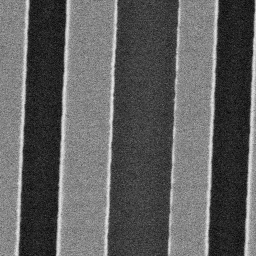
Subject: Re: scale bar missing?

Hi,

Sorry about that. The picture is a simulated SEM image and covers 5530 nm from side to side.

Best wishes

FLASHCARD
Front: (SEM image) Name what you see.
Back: lines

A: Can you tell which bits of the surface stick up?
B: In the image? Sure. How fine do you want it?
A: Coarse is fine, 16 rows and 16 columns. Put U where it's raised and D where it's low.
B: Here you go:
UUDDUUUDDDDUUUDD
UUDDUUUDDDDUUUDD
UUDDUUUDDDDUUUDD
UUDDUUUDDDDUUDDD
UUDDUUUDDDDUUDDD
UUDDUUUDDDDUUDDD
UUDDUUUDDDDUUDDD
UDDDUUUDDDDUUDDD
UDDDUUUDDDDUUDDD
UDDDUUUDDDDUUDDD
UDDDUUUDDDDUUDDD
UDDDUUUDDDDUUDDU
UDDDUUUDDDDUUDDU
UDDDUUUDDDDUUDDU
UDDDUUUDDDDUUDDU
UDDDUUUDDDDUUDDU